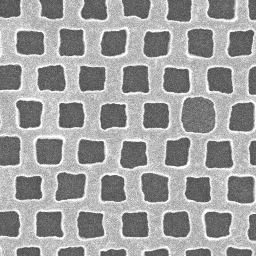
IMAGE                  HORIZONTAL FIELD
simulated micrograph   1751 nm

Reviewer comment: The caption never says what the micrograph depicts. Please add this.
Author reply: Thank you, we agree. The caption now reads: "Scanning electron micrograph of a regular array of holes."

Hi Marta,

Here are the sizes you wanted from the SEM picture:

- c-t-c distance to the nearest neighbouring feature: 279 nm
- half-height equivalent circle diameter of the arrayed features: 194 nm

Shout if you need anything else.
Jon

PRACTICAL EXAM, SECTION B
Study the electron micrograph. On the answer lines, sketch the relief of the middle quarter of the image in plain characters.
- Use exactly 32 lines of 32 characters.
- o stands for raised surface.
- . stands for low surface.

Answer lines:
ooooooooooooooo......ooooooooooo
oooo.......oooo......oooo......o
oooo.......oooo......oooo......o
oooo.......oooo......oooo......o
.ooo......ooooo......oooo......o
.ooo......oooo.......oooo.......
oooo.....ooooo.......oooo......o
oooooooooooooooooooooooooooo.ooo
ooooooooooooooooooooooooooooooo.
oo..oooooooooooooooooooooooooo..
.....oooo.......oooo......oooo..
.....oooo......ooooo......ooo...
.....oooo.......oooo......ooo...
.....oooo.......oooo......ooo...
.....oooo.......oooo......ooo...
.....oooo.......oooo......oooo..
oooooooooooooooooooooooooooooo..
oooooooooooooooooooooooooooooooo
oooooooooooooooooooooooooooooo.o
oooo......ooooo.....oooooo......
ooo.......oooo.......ooooo......
ooo.......oooo.......oooo......o
ooo.......oooo.......oooo......o
ooo.......oooo.......oooo......o
oooo.....ooooo.......oooo......o
oooooooooooooo......ooooooo...oo
oooooooooooooooooooooooooooooooo
.....ooooooooooooooo....oooooooo
......ooo......oooo.......ooooo.
......ooo......oooo.......oooo..
.....oooo......oooo.......oooo..
.....oooo......oooo.......oooo..